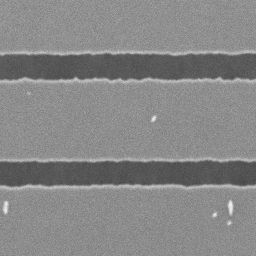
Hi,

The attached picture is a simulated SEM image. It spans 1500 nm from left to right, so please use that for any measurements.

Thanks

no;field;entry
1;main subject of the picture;lines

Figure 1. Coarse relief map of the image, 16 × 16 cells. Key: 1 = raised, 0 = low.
1111111111111111
1111111111111111
1111111111111111
0000000000000000
0000000000000000
1111111111111111
1111111111111111
1111111111111111
1111111111111111
1111111111111111
0000000000000000
0000000000000000
1111111111111111
1111111111111111
1111111111111111
1111111111111111